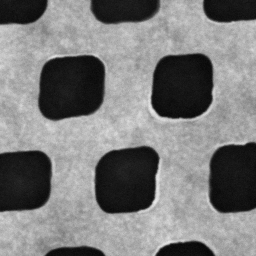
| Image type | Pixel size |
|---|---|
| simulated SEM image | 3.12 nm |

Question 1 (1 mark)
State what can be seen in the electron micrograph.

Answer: holes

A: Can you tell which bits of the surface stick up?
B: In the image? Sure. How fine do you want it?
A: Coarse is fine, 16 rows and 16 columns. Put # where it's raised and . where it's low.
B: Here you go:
...###....###...
################
################
####..####...###
###....###...###
##.....###...###
##....####...###
################
################
#..####...###...
...###....###...
...###....###...
...###....###...
################
################
####..####...###